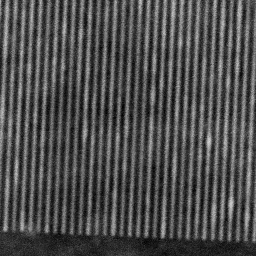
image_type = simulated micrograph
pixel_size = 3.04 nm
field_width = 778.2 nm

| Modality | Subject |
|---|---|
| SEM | parallel lines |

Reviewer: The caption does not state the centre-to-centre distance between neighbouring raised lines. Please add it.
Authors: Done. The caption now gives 8.29 px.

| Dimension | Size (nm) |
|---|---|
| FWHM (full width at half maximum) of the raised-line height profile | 7.2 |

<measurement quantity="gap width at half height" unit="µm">0.0182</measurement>